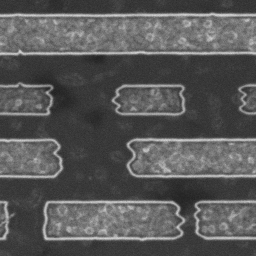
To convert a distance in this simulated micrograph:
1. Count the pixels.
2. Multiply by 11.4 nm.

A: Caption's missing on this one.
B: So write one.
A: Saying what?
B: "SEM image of parallel lines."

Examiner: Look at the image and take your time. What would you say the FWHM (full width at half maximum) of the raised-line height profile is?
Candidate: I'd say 0.308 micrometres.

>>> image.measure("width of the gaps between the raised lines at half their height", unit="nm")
412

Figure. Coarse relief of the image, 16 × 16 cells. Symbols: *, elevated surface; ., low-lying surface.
****************
................
................
****************
****************
...*****...****.
...****....****.
****************
****************
....****........
....****........
****************
****************
***........*....
***........**...
****************